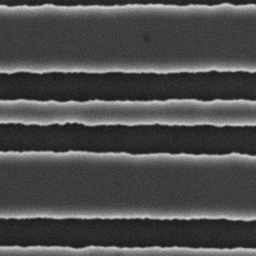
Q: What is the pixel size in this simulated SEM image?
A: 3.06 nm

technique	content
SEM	lines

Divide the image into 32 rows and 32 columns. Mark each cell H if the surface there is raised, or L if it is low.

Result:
LLLLLLLLLLLLLLLLLLLLLLLLLLLLHLLL
HHHHHHHHHHHHHHHHHHHHHHHHHHHHHHHH
HHHHHHHHHHHHHHHHHHHHHHHHHHHHHHHH
HHHHHHHHHHHHHHHHHHHHHHHHHHHHHHHH
HHHHHHHHHHHHHHHHHHHHHHHHHHHHHHHH
HHHHHHHHHHHHHHHHHHHHHHHHHHHHHHHH
HHHHHHHHHHHHHHHHHHHHHHHHHHHHHHHH
HHHHHHHHHHHHHHHHHHHHHHHHHHHHHHHH
HHHHHHHHHHHHHHHHHHHHHHHHHHHHHHHH
LLLLLLLLLLLLLLLLLLLLLLLLLLLLLLLL
LLLLLLLLLLLLLLLLLLLLLLLLLLLLLLLL
LLLLLLLLLLLLLLLLLLLLLLLLLLLLLLLL
LLHHLLLLLLLLLLLLLLLLLHHHHLLHLHHL
HHHHHHHHHHHHHHHHHHHHHHHHHHHHHHHH
HHHHHHHHHHHHHHHHHHHHHHHHHHHHHHHH
LLLHHHLLLLHHHHHHHHHLHHHHHHHHHHHH
LLLLLLLLLLLLLLLLLLLLLLLLLLLLLLLL
LLLLLLLLLLLLLLLLLLLLLLLLLLLLLLLL
LLLLLLLLLLLLLLLLLLLLLLLLLLLLLLLL
HHHHHHHHHHHHHHHHHHHHHHHHHHHHHHHH
HHHHHHHHHHHHHHHHHHHHHHHHHHHHHHHH
HHHHHHHHHHHHHHHHHHHHHHHHHHHHHHHH
HHHHHHHHHHHHHHHHHHHHHHHHHHHHHHHH
HHHHHHHHHHHHHHHHHHHHHHHHHHHHHHHH
HHHHHHHHHHHHHHHHHHHHHHHHHHHHHHHH
HHHHHHHHHHHHHHHHHHHHHHHHHHHHHHHH
HHHHHHHHHHHHHHHHHHHHHHHHHHHHHHHH
LLLLLLLLLLLLLLLLLLLLLLLLLLLLLHHH
LLLLLLLLLLLLLLLLLLLLLLLLLLLLLLLL
LLLLLLLLLLLLLLLLLLLLLLLLLLLLLLLL
LLLLLLLLLLLLLLLLLLLLLLLLLLLLLLLL
HHHHHHHHHHHHHHHHHHHHHHHHHHHHHHHH